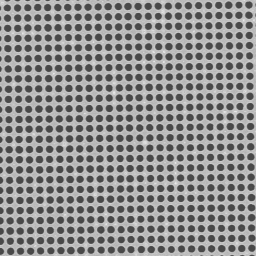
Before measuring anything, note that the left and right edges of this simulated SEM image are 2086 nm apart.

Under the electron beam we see a regular array of holes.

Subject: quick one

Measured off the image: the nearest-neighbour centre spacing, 80.1 nanometres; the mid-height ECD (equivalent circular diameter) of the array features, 0.0596 µm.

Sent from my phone